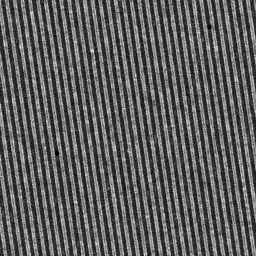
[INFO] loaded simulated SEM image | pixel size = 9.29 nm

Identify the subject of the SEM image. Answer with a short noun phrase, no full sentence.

parallel lines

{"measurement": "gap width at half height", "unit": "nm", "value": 47.1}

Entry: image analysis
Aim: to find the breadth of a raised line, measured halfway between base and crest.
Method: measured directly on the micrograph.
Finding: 2.72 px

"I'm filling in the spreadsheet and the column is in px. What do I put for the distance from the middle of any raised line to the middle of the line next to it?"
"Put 7.7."